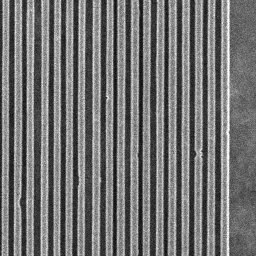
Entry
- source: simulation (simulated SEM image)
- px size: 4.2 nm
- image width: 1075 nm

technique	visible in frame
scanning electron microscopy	parallel lines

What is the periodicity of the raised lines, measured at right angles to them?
0.0543 µm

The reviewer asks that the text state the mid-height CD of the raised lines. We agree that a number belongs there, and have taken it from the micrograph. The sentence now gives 29.9 nanometres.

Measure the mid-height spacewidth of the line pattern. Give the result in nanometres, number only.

26.2